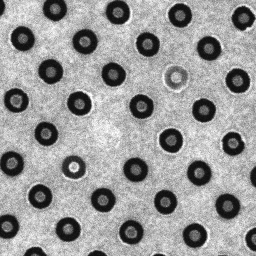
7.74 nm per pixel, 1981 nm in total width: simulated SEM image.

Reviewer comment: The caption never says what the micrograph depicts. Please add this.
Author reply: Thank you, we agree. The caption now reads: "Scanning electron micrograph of a regular array of ring-shaped grooves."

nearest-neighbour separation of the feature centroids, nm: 337